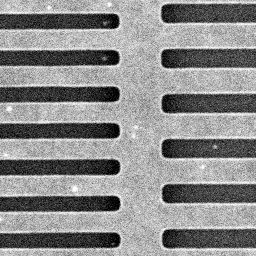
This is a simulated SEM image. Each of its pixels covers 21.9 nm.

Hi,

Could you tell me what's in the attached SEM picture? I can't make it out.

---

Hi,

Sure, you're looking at groups of lines, slits or small figures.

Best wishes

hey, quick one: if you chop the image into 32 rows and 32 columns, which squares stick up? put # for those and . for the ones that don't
#####################...........
####################............
...............#####............
...............#################
################################
################################
...............#####............
...............#####............
#####################...........
################################
################################
...............#################
...............#####............
####################............
################################
...............#################
...............#################
#####################...........
####################............
####################............
...............#################
...............#################
################################
####################............
...............#####............
...............######...........
.............###################
################################
#####################...........
...............#####............
...............#####............
################################